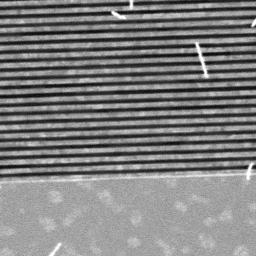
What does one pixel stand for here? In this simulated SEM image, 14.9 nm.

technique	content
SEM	parallel lines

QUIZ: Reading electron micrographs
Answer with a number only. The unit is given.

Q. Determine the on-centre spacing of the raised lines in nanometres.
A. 131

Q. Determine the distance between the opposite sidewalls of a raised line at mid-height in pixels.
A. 4.75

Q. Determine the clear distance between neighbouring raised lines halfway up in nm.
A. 68.9